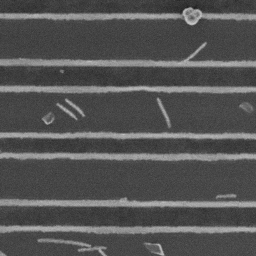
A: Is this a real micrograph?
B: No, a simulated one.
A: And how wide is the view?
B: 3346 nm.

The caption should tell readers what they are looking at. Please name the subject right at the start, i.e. lines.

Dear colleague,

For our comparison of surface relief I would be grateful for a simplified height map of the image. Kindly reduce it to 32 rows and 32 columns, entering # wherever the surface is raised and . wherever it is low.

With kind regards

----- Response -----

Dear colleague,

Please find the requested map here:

................................
.......................##.......
################################
################################
################################
################################
################################
################################
................................
................................
................................
################################
################################
################################
################################
################################
################################
................................
................................
#########..#..................#.
################################
################################
################################
################################
################################
................................
................................
................................
................................
################################
################################
################################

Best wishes